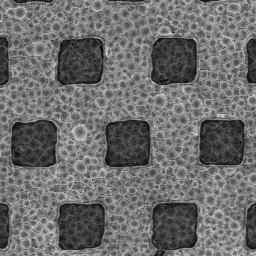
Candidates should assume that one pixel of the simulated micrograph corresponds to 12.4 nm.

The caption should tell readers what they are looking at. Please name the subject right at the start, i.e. holes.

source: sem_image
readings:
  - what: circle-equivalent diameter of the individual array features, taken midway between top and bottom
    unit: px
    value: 50.7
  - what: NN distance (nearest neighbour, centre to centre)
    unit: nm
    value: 1150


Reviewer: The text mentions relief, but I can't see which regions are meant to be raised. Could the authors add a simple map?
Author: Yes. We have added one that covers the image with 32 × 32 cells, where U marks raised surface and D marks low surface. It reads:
UUUUUUUUUUUUUUUUUUUUUUUUUUUUUUUU
UUUUUUUUUUUUUUUUUUUUUUUUUUUUUUUU
UUUUUUUUUUUUUUUUUUUUUUUUUUUUUUUU
UUUUUUUUUUUUUUUUUUUUUUUUUUUUUUUU
UUUUUUUUUUUUUUUUUUUUUUUUUUUUUUUU
DUUUUUUUDDDDDUUUUUUDDDDDDUUUUUUD
DUUUUUUDDDDDDUUUUUUDDDDDDUUUUUUD
DUUUUUUDDDDDDUUUUUUDDDDDDUUUUUUD
DUUUUUUDDDDDDUUUUUUDDDDDDUUUUUUD
DUUUUUUDDDDDDUUUUUUDDDDDDUUUUUUD
DUUUUUUUDDUDUUUUUUUUDUUUUUUUUUUU
UUUUUUUUUUUUUUUUUUUUUUUUUUUUUUUU
UUUUUUUUUUUUUUUUUUUUUUUUUUUUUUUU
UUUUUUUUUUUUUUUUUUUUUUUUUUUUUUUU
UUUUUUUUUUUUUUUUUUUUUUUUUUUUUUUU
UUDDDDDUUUUUUUDDDDDUUUUUUDDDDDUU
UDDDDDDUUUUUUDDDDDDUUUUUUDDDDDDU
UDDDDDDUUUUUUDDDDDDUUUUUUDDDDDDU
UDDDDDDUUUUUUDDDDDDUUUUUUDDDDDDU
UDDDDDDUUUUUUDDDDDDUUUUUUDDDDDUU
UUDDDDDUUUUUUDDDDDUUUUUUUDDDDDUU
UUUUUUUUUUUUUUUUUUUUUUUUUUUUUUUU
UUUUUUUUUUUUUUUUUUUUUUUUUUUUUUUU
UUUUUUUUUUUUUUUUUUUUUUUUUUUUUUUU
UUUUUUUUUUUUUUUUUUUUUUUUUUUUUUUU
DUUUUUUUDDDDUUUUUUUUDDDDUUUUUUUD
DUUUUUUDDDDDDUUUUUUDDDDDDUUUUUUD
DUUUUUUDDDDDDUUUUUUDDDDDDUUUUUUD
DUUUUUUDDDDDDUUUUUUDDDDDDUUUUUUD
DUUUUUUDDDDDDUUUUUUDDDDDDUUUUUUD
DUUUUUUDDDDDDUUUUUUDDDDDDUUUUUUD
UUUUUUUUUUUUUUUUUUUDDUUUUUUUUUUU